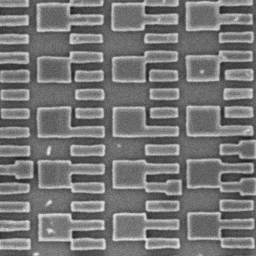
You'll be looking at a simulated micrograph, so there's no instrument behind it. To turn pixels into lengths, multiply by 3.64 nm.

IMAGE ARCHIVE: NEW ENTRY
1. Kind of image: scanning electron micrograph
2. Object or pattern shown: wiring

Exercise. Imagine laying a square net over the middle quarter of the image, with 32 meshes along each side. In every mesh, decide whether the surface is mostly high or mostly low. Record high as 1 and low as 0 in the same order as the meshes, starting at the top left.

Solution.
10000000000011111111000000000001
11000000000011111111001000000001
11011111110011111111011111110001
11011111110011111111011111110001
00000000000000000000000000000000
00000000000000000000000000000000
00000111100000000000001111111000
00011111110000000000001111111000
00011111110000000000001111111000
00000000000000000000000000000000
00000000000000000000000000000000
11011111110011111111001111110001
11011111110011111111001111110001
11000000000011111111000000000001
10000000000011111111000000000001
11000000000011111111100000000001
11111111110011111111111111111001
11111111110011111111111111111001
00000000000000000000000000000000
00000000000000000000000000000000
00100001110000000000011111111000
00111111110000000000011111111000
00111111110000000000011111111000
00000000000000000000000000000000
10000000000011111111000000000001
11111111110011111111111111111001
11111111110011111111111111111001
11000000000011111111100000000001
11000000000011111111000000000001
11000000000011111111100000111001
11111111110011111111111111111001
00111111110000000000011111111000